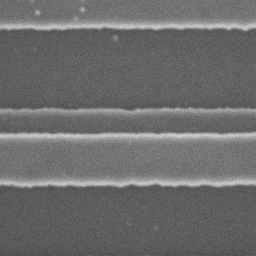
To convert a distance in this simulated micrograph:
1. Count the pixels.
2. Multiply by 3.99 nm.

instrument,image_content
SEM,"lines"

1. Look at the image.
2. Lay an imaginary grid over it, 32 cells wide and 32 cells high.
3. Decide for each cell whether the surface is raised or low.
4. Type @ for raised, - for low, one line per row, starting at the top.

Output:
@@@@@@@@@@@@@@@@@@@@@@@@@@@@@@@@
@@@@@@@@@@@@@@@@@@@@@@@@@@@@@@@@
@@@@@@@@@@@@@@@@@@@@@@@@@@@@@@@@
@@--@@@@@----------@--@-----@-@-
--------------------------------
--------------------------------
--------------------------------
--------------------------------
--------------------------------
--------------------------------
--------------------------------
--------------------------------
--------------------------------
--------------------------------
--------------------------------
--------------------------------
--------------------------------
@@@@@@@@@@@@@@@@@@@@@@@@@@@@@@@@
@@@@@@@@@@@@@@@@@@@@@@@@@@@@@@@@
@@@@@@@@@@@@@@@@@@@@@@@@@@@@@@@@
@@@@@@@@@@@@@@@@@@@@@@@@@@@@@@@@
@@@@@@@@@@@@@@@@@@@@@@@@@@@@@@@@
@@@@@@@@@@@@@@@@@@@@@@@@@@@@@@@@
--------------------------------
--------------------------------
--------------------------------
--------------------------------
--------------------------------
--------------------------------
--------------------------------
--------------------------------
--------------------------------